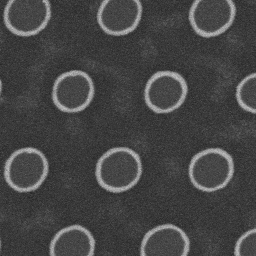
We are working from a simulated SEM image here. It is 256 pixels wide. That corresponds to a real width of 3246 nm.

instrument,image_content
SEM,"raised bodies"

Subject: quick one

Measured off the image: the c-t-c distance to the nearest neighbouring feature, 1140 nm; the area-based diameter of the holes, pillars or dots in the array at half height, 511 nanometers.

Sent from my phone